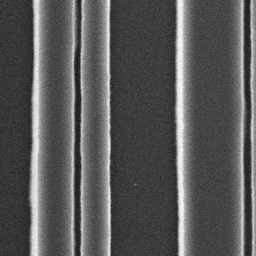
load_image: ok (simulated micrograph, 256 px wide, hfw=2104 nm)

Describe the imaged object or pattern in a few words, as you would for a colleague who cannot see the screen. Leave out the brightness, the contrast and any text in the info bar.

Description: lines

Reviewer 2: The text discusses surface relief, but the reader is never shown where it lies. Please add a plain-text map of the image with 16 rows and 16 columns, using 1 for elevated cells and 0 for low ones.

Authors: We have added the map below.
0011111000011111
0011111000011111
0011111000011111
0011111000011111
0011111000011111
0011111000011111
0011111000011111
0011111000011111
0011111000011111
0011111000011111
0011111000011111
0011111000011111
0011111000011111
0011111000011111
0011111000011111
0011111000011111